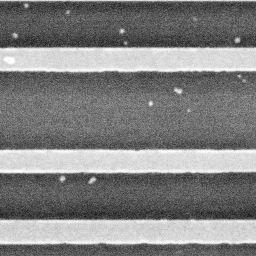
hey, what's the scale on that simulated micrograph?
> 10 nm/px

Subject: lines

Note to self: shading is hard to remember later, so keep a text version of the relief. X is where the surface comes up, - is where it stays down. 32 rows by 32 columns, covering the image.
--------------------------------
--------------------------------
--------------------------------
--------------------------------
--------------------------------
--------------------------------
XXXXXXXXXXXXXXXXXXXXXXXXXXXXXXXX
XXXXXXXXXXXXXXXXXXXXXXXXXXXXXXXX
XXXXXXXXXXXXXXXXXXXXXXXXXXXXXXXX
--------------------------------
--------------------------------
--------------------------------
--------------------------------
--------------------------------
--------------------------------
--------------------------------
--------------------------------
--------------------------------
--------------------------------
XXXXXXXXXXXXXXXXXXXXXXXXXXXXXXXX
XXXXXXXXXXXXXXXXXXXXXXXXXXXXXXXX
--------------------------------
--------------------------------
--------------------------------
--------------------------------
--------------------------------
--------------------------------
--------------------------------
XXXXXXXXXXXXXXXXXXXXXXXXXXXXXXXX
XXXXXXXXXXXXXXXXXXXXXXXXXXXXXXXX
--------------------------------
--------------------------------